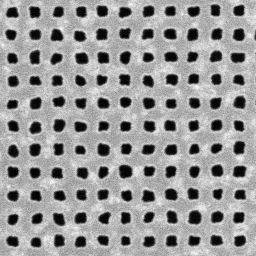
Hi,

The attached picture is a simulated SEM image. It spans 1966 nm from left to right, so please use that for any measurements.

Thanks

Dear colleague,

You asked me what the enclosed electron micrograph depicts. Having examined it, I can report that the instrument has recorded a regular array of holes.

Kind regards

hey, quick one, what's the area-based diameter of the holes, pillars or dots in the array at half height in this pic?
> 87.9 nanometres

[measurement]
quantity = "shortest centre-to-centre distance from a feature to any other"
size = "0.168 µm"